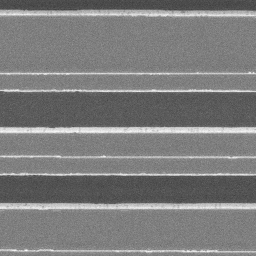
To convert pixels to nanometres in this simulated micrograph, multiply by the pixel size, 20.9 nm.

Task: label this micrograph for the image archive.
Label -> lines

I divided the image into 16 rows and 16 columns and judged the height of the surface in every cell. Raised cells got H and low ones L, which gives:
LLLLLLLLLLLLLLLL
HHHHHHHHHHHHHHHH
HHHHHHHHHHHHHHHH
HHHHHHHHHHHHHHHH
HHHHHHHHHHHHHHHH
HHHHHHHHHHHHHHHH
LLLLLLLLLLLLLLLL
LLLLLLLLLLLLLLLL
HHHHHHHHHHHHHHHH
HHHHHHHHHHHHHHHH
HHHHHHHHHHHHHHHH
LLLLLLLLLLLLLLLL
LLLLLLLLLLLLLLLL
HHHHHHHHHHHHHHHH
HHHHHHHHHHHHHHHH
HHHHHHHHHHHHHHHH